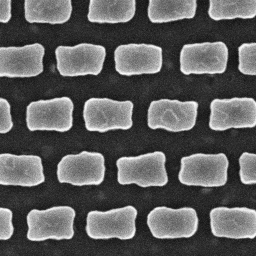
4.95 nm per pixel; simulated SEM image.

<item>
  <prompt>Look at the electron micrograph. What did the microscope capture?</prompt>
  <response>a regular array of raised bodies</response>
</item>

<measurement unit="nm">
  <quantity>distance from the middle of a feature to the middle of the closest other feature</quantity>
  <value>296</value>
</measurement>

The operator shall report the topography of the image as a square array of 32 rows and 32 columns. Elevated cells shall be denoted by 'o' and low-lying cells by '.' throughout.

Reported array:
o..oooooo..oooooo..ooooo..oooooo
o..oooooo..oooooo..ooooo..oooooo
o..ooooo...ooooo...ooo..........
................................
................................
....o...........o........ooo...o
oooooo.oooooo.oooooo...ooooo..oo
ooooo..oooooo.oooooo...ooooo..oo
ooooo..oooooo.oooooo...ooooo..oo
...o............................
................................
................................
......ooo..ooo......o........ooo
o..oooooo..oooooo..oooooo.oooooo
o..oooooo..ooooo...ooooo..oooooo
o..oooooo..ooooo...ooooo..oooooo
................................
................................
................................
oooo....ooooo.....oo....oooo..oo
ooooo..oooooo..oooooo..oooooo.oo
ooooo..oooooo..oooooo..ooooo..oo
ooooo...ooooo..oooooo..ooooo..oo
................................
................................
................................
o...ooooo....oooo..ooooo..oooooo
o..oooooo..oooooo.ooooooo.oooooo
oo..ooooo..oooooo..ooooo..oooooo
o..oooooo..oooooo..ooooo...ooooo
................................
................................